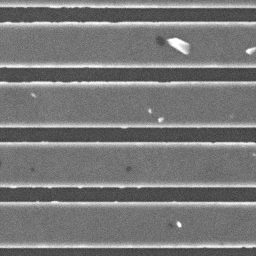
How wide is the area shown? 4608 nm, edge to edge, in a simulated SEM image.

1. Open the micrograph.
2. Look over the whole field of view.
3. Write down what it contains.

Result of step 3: lines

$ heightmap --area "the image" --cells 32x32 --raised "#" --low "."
################################
................................
................................
################################
################################
################################
################################
################################
................................
................................
################################
################################
################################
################################
################################
################################
................................
................................
################################
################################
################################
################################
################################
................................
................................
################################
################################
################################
################################
################################
################################
................................